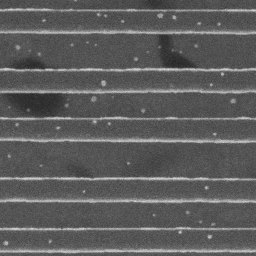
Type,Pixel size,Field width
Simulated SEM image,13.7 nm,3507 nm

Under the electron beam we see lines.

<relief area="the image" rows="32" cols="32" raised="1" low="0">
00000000000000000000000000000000
11111111111111111111111111111111
11111111111111111111111111111111
11111111111111111111111111111111
00000000000000000000000000000000
00000000000000000000000000000000
00000000000000000000000000000000
00000000000000000000000000000000
00000000000000000000000000000000
11111111111111111111111111111111
11111111111111111111111111111111
00000100011000000000000000000000
00000000000000000000000000000000
00000000000000000000000000000000
00000000000000000000000000000000
11111111111111111111111111111111
11111111111111111111111111111111
00111111111111111111111111111111
00000000000000000000000000000000
00000000000000000000000000000000
00000000000000000000000000000000
00000000000000000000000000000000
11111111111111111111111111111111
11111111111111111111111111111111
11111111111111111111111111111111
00000000000000000000000000000000
00000000000000000000000000000000
00000000000000000000000000000000
00000000000000000000000000000000
11111111111111111111111111111111
11111111111111111111111111111111
00000000000000000000000000000000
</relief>